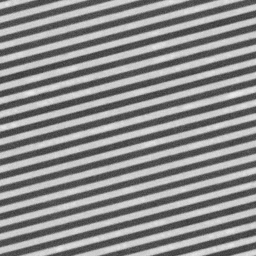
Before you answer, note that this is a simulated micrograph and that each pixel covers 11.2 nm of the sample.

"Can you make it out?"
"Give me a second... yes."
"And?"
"parallel lines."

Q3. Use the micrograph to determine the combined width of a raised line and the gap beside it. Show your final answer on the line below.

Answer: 147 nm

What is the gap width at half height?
79.8 nm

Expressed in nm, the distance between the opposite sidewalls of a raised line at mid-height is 69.